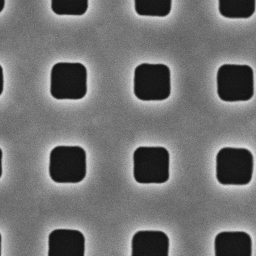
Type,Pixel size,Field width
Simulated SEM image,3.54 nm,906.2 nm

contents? holes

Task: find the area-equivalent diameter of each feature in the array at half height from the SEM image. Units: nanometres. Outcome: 142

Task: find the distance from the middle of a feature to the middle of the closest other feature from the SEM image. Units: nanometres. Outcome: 294